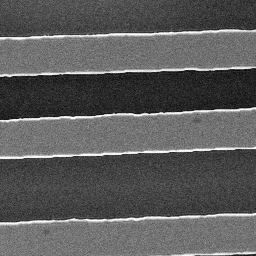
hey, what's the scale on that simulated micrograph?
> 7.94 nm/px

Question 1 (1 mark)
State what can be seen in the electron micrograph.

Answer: lines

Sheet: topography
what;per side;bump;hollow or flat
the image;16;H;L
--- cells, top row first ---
LLLLLLLLLLLLLLLL
LLLLLLLLLLLLLLLL
HHHHHHHHHHHHHHHH
HHHHHHHHHHHHHHHH
HHHHHHHHLLLLLLLL
LLLLLLLLLLLLLLLL
LLLLLLLLLLLLLLLL
HHHHHHHHHHHHHHHH
HHHHHHHHHHHHHHHH
HHHHHHHHHHHLLLLL
LLLLLLLLLLLLLLLL
LLLLLLLLLLLLLLLL
LLLLLLLLLLLLLLLL
LLLLLLLLLLLLLHHH
HHHHHHHHHHHHHHHH
HHHHHHHHHHHHHHHH